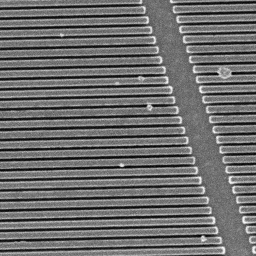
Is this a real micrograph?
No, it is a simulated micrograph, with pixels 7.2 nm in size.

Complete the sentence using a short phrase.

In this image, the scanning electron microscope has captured parallel lines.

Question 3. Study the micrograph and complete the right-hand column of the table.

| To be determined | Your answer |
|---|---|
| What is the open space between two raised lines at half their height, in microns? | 0.0207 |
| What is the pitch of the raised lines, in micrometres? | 0.0727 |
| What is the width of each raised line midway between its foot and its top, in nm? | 47.7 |